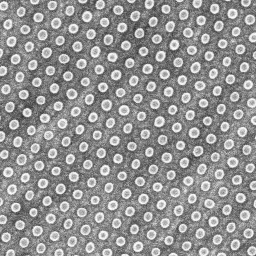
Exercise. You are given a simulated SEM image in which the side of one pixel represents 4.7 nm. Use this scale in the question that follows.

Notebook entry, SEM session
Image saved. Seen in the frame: a regular array of raised bodies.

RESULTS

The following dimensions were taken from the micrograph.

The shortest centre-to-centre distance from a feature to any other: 83.9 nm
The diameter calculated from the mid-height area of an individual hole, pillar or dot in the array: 8.74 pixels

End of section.